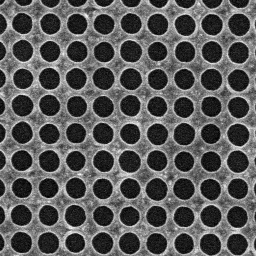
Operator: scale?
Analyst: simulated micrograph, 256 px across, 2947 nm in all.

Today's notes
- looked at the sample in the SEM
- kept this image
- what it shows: a regular array of holes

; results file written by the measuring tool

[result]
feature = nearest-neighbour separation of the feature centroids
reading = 307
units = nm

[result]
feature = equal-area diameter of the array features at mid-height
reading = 248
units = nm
